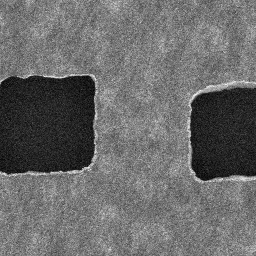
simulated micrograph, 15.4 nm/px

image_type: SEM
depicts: holes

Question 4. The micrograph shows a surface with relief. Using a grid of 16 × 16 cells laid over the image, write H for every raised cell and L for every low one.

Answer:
HHHHHHHHHHHHHHHH
HHHHHHHHHHHHHHHH
HHHHHHHHHHHHHHHH
HHHHHHHHHHHHHHHH
HHHHHHHHHHHHHHHH
LLLLLLHHHHHHHHLL
LLLLLLHHHHHHLLLL
LLLLLLHHHHHHLLLL
LLLLLLHHHHHHLLLL
LLLLLLHHHHHHLLLL
LLLLLHHHHHHHLLLL
HHHHHHHHHHHHHHHH
HHHHHHHHHHHHHHHH
HHHHHHHHHHHHHHHH
HHHHHHHHHHHHHHHH
HHHHHHHHHHHHHHHH